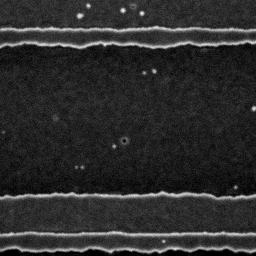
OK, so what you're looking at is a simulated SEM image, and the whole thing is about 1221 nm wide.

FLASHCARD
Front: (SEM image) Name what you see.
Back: lines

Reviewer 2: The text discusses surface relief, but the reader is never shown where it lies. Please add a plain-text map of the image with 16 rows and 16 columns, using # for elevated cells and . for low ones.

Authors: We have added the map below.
################
################
################
................
................
................
................
................
................
................
................
................
################
################
################
################